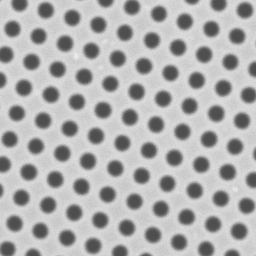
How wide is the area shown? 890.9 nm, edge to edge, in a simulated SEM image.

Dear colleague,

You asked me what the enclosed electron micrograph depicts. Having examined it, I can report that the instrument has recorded a regular array of holes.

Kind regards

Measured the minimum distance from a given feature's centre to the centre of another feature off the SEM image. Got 92.5 nm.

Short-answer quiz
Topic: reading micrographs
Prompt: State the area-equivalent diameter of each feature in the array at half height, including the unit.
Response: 55.3 nanometres